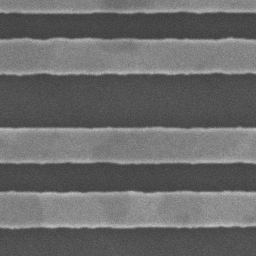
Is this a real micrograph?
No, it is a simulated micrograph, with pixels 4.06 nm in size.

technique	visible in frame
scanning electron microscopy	lines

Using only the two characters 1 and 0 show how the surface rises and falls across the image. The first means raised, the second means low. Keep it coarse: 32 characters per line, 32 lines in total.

11111111111111111111111111111111
10111111111100111011000011000000
00000000000000000000000000000000
00000000000000000000000000000000
00000000000000000000000000000000
11111111111111111111111111111111
11111111111111111111111111111111
11111111111111111111111111111111
11111111111111111111111111111111
00000000000000000000000000000000
00000000000000000000000000000000
00000000000000000000000000000000
00000000000000000000000000000000
00000000000000000000000000000000
00000000000000000000000000000000
00000000000000000000000000000000
11111111111111111111111111111111
11111111111111111111111111111111
11111111111111111111111111111111
11111111111111111111111111111111
00000000000000000000000000000000
00000000000000000000000000000000
00000000000000000000000000000000
00000000000000000000000000000000
11111111111111111111111111111111
11111111111111111111111111111111
11111111111111111111111111111111
11111111111111111111111111111111
01100000000000000000000000000000
00000000000000000000000000000000
00000000000000000000000000000000
00000000000000000000000000000000